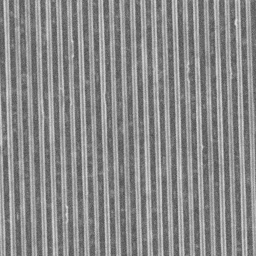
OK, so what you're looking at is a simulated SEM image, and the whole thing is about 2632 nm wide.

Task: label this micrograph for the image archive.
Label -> parallel lines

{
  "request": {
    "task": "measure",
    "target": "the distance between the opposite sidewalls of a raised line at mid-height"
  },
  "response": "37.3 nm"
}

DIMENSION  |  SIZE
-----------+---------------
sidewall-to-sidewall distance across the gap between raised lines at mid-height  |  65.5 nanometres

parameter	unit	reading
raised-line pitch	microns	0.108